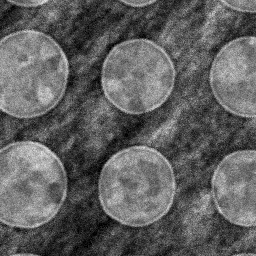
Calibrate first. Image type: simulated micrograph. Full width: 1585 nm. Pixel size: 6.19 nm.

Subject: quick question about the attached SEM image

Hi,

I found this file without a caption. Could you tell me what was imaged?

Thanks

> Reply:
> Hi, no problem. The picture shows raised bodies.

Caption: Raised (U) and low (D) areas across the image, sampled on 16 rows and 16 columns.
DDDDDDDDDDDDDDDU
DDDDDDDDDDDDDDDD
UUUDDDDDUDDDDDDU
UUUUDDDUUUDDDDUU
UUUUDDUUUUUDDUUU
UUUUDDUUUUUDDUUU
UUUDDDDUUUDDDDUU
DDDDDDDDDDDDDDDD
DDDDDDDDDDDDDDDD
UUUDDDDDUUDDDDDU
UUUUDDDUUUUDDDUU
UUUUDDUUUUUDDUUU
UUUUDDUUUUUDDUUU
UUUDDDDUUUDDDDUU
DDDDDDDDDDDDDDDD
DDDDDDDDDDDDDDDD